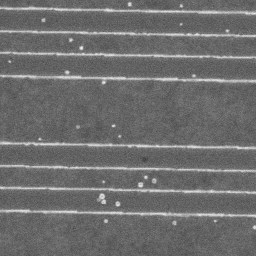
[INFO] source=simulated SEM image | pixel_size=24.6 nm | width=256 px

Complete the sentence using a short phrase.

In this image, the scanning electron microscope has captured lines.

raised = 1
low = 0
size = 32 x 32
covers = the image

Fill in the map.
11111111111111111111111111111111
00000000000000000000000011111111
00000000000000000000000000000000
00000000000000000000000000000000
11111111111111111111111111111100
11111111111111111111111111111111
11111111111111111111111111111111
00000000000000000000000000000000
00000000000000000000000000000000
00000000000000000000000000000000
11111111111111111111111111111111
11111111111111111111111111111111
11111111111111111111111111111111
11111111111111111111111111111111
11111111111111111111111111111111
11111111111111111111111111111111
11111111111111111111111111111111
11111111111111111111111111111111
00000000000000000000000000000011
00000000000000000000000000000000
00000000000000000000000000000000
11111111111111111111111111111111
11111111111111111111111111111111
00000011111111111111111111111111
00000000000000000000000000000000
00000000000000000000000000000000
11111111100000000000000000000000
11111111111111111111111111111111
11111111111111111111111111111111
11111111111111111111111111111111
11111111111111111111111111111111
11111111111111111111111111111111